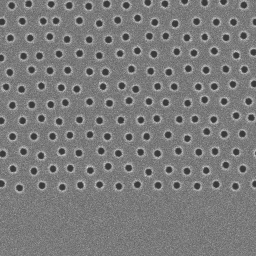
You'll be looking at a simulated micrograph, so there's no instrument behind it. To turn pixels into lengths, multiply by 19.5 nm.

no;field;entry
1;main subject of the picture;a regular array of holes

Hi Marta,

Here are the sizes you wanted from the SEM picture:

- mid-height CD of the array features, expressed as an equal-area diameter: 137 nm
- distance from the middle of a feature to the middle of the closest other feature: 0.326 µm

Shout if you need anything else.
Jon